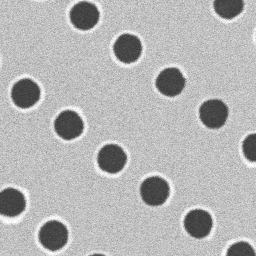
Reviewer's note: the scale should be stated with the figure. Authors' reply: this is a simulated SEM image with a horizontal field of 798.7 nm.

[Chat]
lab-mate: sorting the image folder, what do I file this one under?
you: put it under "a regular array of holes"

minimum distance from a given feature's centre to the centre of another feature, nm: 168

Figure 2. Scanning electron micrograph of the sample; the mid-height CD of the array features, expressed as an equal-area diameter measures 91.7 nm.